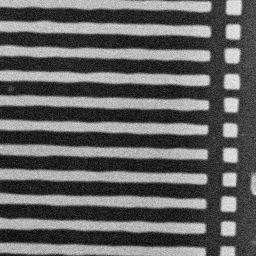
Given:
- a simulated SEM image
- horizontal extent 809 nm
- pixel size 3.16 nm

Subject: groups of lines, slits or small figures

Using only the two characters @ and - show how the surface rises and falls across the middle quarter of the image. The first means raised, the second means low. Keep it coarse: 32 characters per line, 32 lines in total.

--------------------------------
--------------------------------
@@@@@@@@@@@@@@@@-@@@@-----------
@@@@@@@@@@@@@@@@@@@@@@@@@@@@@@@@
----------@@@@@@@@@@@@@@@@@@@@@@
--------------------------------
--------------------------------
--------------------------------
@@@@@@@-------------------------
@@@@@@@@@@@@@@@@@@@@@@@@@@@@@@@@
--@@@@@@@@@@@@@@@@@@@@@@@@@@@@@@
-----------------------------@@-
--------------------------------
--------------------------------
--------------------------------
@@@@@@@@@@@@@@@@@@@@@@@@@@@@@@@@
@@@@@@@@@@@@@@@@@@@@@@@@@@@@@@@@
----------------------------@@@@
--------------------------------
--------------------------------
--------------------------------
@@@@@@@@@@@@@@@@@@@@@@@@@-@@@@@-
@@@@@@@@@@@@@@@@@@@@@@@@@@@@@@@@
---------------------------@@@@@
--------------------------------
--------------------------------
--------------------------------
@@@@@@@@@@@@@@@@@@@@@@@@@@@@@@@-
@@@@@@@@@@@@@@@@@@@@@@@@@@@@@@@@
--------------------------@@@@@@
--------------------------------
--------------------------------